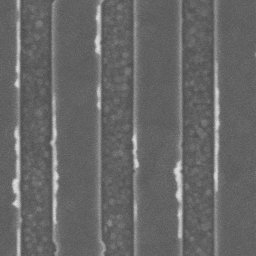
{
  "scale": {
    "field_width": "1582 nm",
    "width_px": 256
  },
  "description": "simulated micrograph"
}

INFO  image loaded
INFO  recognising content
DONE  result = one or a few lines or trenches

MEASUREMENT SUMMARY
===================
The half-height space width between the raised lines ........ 0.205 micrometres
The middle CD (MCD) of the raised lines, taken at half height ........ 47.9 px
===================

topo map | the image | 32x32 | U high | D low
UUDDDDDUUUUUUDDDDUUUUUUDDDDUUUUU
UUDDDDDUUUUUUDDDDUUUUUUDDDDUUUUU
UUDDDDDUUUUUUDDDDUUUUUUDDDDUUUUU
UUDDDDDUUUUUUDDDDUUUUUUDDDDUUUUU
UUUDDDDUUUUUUDDDDUUUUUUDDDDUUUUU
UUUDDDDUUUUUUDDDDUUUUUUDDDDUUUUU
UUUDDDDUUUUUUDDDDUUUUUUDDDDUUUUU
UUDDDDDUUUUUUDDDDUUUUUUDDDDUUUUU
UUDDDDDUUUUUUDDDDUUUUUUDDDDUUUUU
UUDDDDDUUUUUUDDDDUUUUUUDDDDUUUUU
UUDDDDDUUUUUUDDDDUUUUUUDDDDUUUUU
UUDDDDDUUUUUUDDDDUUUUUUDDDDUUUUU
UUDDDDDUUUUUUDDDDUUUUUUDDDDUUUUU
UUDDDDDUUUUUUDDDDUUUUUUDDDDUUUUU
UUDDDDDUUUUUUDDDDUUUUUUDDDDUUUUU
UUDDDDDUUUUUUDDDDUUUUUUDDDDUUUUU
UUDDDDDUUUUUUDDDDUUUUUUDDDDUUUUU
UUDDDDUUUUUUUDDDDUUUUUUDDDDUUUUU
UUDDDDDUUUUUUDDDDUUUUUUDDDDUUUUU
UUDDDDDUUUUUUDDDDUUUUUUDDDDUUUUU
UUDDDDDUUUUUUDDDDUUUUUUDDDDUUUUU
UUDDDDDUUUUUUDDDDUUUUUUDDDDUUUUU
UUDDDDDUUUUUUDDDDUUUUUUDDDDUUUUU
UUDDDDDUUUUUUDDDDUUUUUUDDDDUUUUU
UUUDDDDUUUUUUDDDDUUUUUUDDDDUUUUU
UUUDDDDUUUUUUDDDDUUUUUUDDDDUUUUU
UUUDDDDUUUUUUDDDDUUUUUUDDDDUUUUU
UUUDDDDUUUUUUDDDDUUUUUUDDDDUUUUU
UUUDDDDUUUUUUDDDDUUUUUUDDDDUUUUU
UUUDDDDUUUUUUDDDDUUUUUUDDDDUUUUU
UUUDDDDUUUUUUDDDDUUUUUUDDDDUUUUU
UUUDDDDUUUUUUDDDDUUUUUUDDDDUUUUU